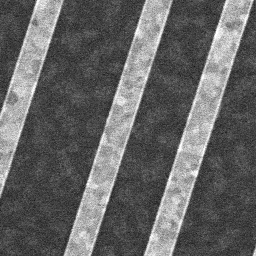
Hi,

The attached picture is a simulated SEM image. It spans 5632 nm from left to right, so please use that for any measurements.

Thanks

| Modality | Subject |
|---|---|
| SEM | one or a few lines or trenches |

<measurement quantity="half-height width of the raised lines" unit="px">23.6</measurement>